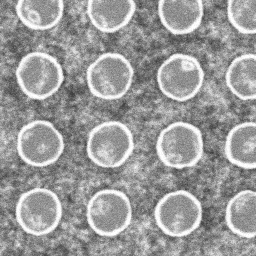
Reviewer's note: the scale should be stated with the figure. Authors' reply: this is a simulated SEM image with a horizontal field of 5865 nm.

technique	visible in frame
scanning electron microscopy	a regular array of raised bodies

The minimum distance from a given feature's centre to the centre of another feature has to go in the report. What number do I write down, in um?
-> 1.56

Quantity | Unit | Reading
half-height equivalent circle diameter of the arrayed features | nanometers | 989